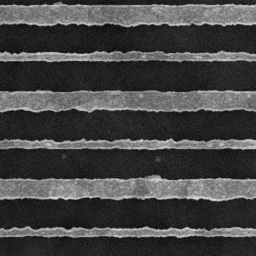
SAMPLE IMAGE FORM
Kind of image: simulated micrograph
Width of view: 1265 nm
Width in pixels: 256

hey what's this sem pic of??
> lines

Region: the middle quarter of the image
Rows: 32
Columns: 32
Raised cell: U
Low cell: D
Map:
DDDDDDDDDDDDDDDDDDDDDDDDDDDDDDDD
DDDDDDDDDDDDDDDDDDDDDDDDDDDDDDDD
DDDDDDDDDDDDDDDDDDDDDDDDDDDDDDDD
DDDDDDDDDDDDDDDDDDDDDDDDDDDDDDDD
DDDDDDDDDDDDDDDDDDDDDDDDDDDDDDDD
DDDDDDDDDDDDDDDDDDDDDDDDDDDDDDDD
DDDDDDDDDDDDDDDDDDDDDDDDDDDDDDDD
UUUUUUUUUUUUUUUUUUUUUUUUUUUUUUUU
UUUUUUUUUUUUUUUUUUUUUUUUUUUUUUUU
UUUUUUUUUUUUUUUUUUUUUUUUUUUUUUUU
UUUUUUUUUUUUUUUUUUUUUUUUUUUUUUUU
UDDDUUUDDDDUUDDDDUDUUUUUUUUUUUUU
DDDDDDDDDDDDDDDDDDDDDDDDDDDDDDDD
DDDDDDDDDDDDDDDDDDDDDDDDDDDDDDDD
DDDDDDDDDDDDDDDDDDDDDDDDDDDDDDDD
DDDDDDDDDDDDDDDDDDDDDDDDDDDDDDDD
DDDDDDDDDDDDDDDDDDDDDDDDDDDDDDDD
DDDDDDDDDDDDDDDDDDDDDDDDDDDDDDDD
DDDDDDDDDDDDDDDDDDDDDDDDDDDDDDDD
UUUUUUUUUUUUUUUUUUUUUUUUUUUUUUUU
UUUUUUUUUUUUUUUUUUUUUUUUUUUUUUUU
DDDDDDDDDDDDDDDDDDDDDDDDDDDDDDDD
DDDDDDDDDDDDDDDDDDDDDDDDDDDDDDDD
DDDDDDDDDDDDDDDDDDDDDDDDDDDDDDDD
DDDDDDDDDDDDDDDDDDDDDDDDDDDDDDDD
DDDDDDDDDDDDDDDDDDDDDDDDDDDDDDDD
DDDDDDDDDDDDDDDDDDDDDDDDDDDDDDDD
DDDDDDDDDDDDDDDDDDDDDDDDDDDDDDDD
DDDDDDDDDDDDDDDDDDDDDDDDDDDDDDDD
UUUUUUUUUUUUUUUUUUUUUUUUUUUUUUUU
UUUUUUUUUUUUUUUUUUUUUUUUUUUUUUUU
UUUUUUUUUUUUUUUUUUUUUUUUUUUUUUUU